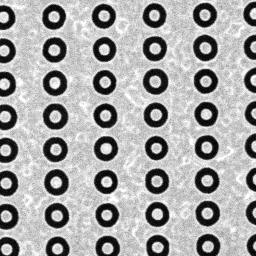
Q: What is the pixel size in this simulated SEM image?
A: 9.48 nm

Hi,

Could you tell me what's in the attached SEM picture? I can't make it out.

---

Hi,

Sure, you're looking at a regular array of ring-shaped grooves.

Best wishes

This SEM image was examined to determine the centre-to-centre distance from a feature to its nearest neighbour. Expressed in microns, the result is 0.313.